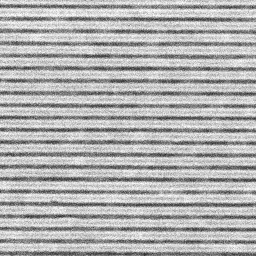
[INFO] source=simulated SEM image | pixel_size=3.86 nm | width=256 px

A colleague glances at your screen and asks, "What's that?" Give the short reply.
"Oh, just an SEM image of parallel lines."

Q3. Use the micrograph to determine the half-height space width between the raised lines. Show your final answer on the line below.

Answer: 20.8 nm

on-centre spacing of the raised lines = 47.7 nm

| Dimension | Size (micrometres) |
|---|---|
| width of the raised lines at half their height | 0.0275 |